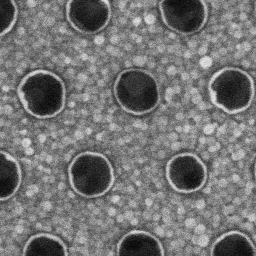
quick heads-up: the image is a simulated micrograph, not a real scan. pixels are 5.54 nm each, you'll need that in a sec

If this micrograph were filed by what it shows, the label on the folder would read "raised bodies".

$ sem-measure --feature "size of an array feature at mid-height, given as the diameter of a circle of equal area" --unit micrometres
0.253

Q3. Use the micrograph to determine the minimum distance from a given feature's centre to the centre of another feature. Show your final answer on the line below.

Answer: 523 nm